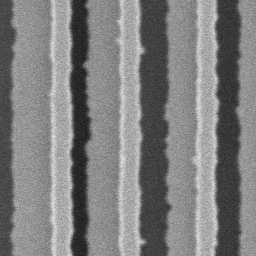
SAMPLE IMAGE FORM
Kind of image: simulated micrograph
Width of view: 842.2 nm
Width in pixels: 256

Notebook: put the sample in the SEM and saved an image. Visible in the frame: lines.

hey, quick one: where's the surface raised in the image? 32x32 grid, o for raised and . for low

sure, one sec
..ooooooo..oooooo....oooooo...oo
..ooooooo..oooooo....oooooo...oo
..ooooooo..oooooo....oooooo...oo
..ooooooo..oooooo....oooooo...oo
..ooooooo..oooooo....oooooo...oo
..ooooooo..ooooooo...oooooo...oo
..ooooooo..ooooooo...oooooo...oo
..ooooooo..oooooo....oooooo...oo
..ooooooo..oooooo....oooooo...oo
..ooooooo..oooooo....oooooo...oo
..ooooooo..oooooo....oooooo...oo
..ooooooo..oooooo....oooooo...oo
.oooooooo..oooooo....oooooo...oo
..ooooooo..oooooo....oooooo...oo
..ooooooo..ooooooo...oooooo...oo
..ooooooo..oooooo....oooooo...oo
..ooooooo..ooooooo...oooooo...oo
..ooooooo..ooooooo...oooooo...oo
..ooooooo..oooooo....oooooo...oo
..ooooooo..oooooo....oooooo...oo
..ooooooo..oooooo....oooooo...oo
..ooooooo..oooooo....oooooo...oo
..ooooooo..oooooo....oooooo...oo
..ooooooo..oooooo....oooooo...oo
..ooooooo..oooooo....oooooo...oo
..ooooooo..oooooo....oooooo...oo
..ooooooo..oooooo....oooooo...oo
..ooooooo..oooooo....oooooo...oo
..ooooooo..oooooo....oooooo...oo
.oooooooo..ooooooo...oooooo...oo
..ooooooo..ooooooo...oooooo...oo
..ooooooo..oooooo....oooooo...oo